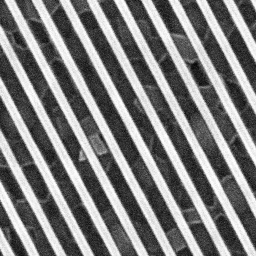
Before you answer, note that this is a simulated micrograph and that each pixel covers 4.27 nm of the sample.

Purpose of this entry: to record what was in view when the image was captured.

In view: parallel lines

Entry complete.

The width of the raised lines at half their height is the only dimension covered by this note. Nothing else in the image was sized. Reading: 7.07 px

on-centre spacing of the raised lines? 0.103 µm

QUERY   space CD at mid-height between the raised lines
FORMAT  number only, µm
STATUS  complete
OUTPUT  0.0713